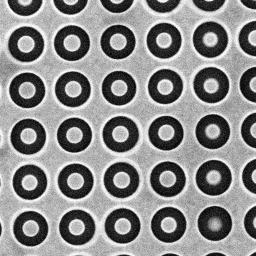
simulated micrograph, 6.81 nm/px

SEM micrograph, an array of small figures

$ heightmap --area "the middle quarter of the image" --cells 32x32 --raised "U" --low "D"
UUUUUUUUUUUUUUUUUUUUUUUUUUUUUUUU
UUUUUUUUUUUUUUUUUUUUUUUDDDDDUUUU
DDDDDUUUUUUDDDDDUUUUUUDDDDDDDUUU
DDDDDDUUUUDDDDDDDUUUUDDDDDDDDDUU
DDDDDDUUUUDDUUUDDDUUUDDDUUUDDDUU
DUUUDDDUUDDDUUUUDDUUUDDUUUUDDDUU
DUUUDDDUUDDDUUUUDDUUUDDDUUUDDDUU
DUUUDDDUUDDDDUUDDDUUUDDDDUDDDDUU
DDDDDDUUUUDDDDDDDDUUUUDDDDDDDUUU
DDDDDDUUUUUDDDDDDUUUUUUDDDDDUUUU
DDDDDUUUUUUUUDDUUUUUUUUUUUUUUUUU
UUUUUUUUUUUUUUUUUUUUUUUUUUUUUUUU
UUUUUUUUUUUUUUUUUUUUUUUUUUUUUUUU
UDDDUUUUUUUUDDDDDUUUUUUDDDDDUUUU
DDDDDDUUUUDDDDDDDDUUUUDDDDDDDUUU
DDDDDDDUUUDDDDDDDDDUUDDDDUDDDDUU
DUUUDDDUUDDDUUUUDDDUUDDDUUUDDDUU
DUUUDDDUUDDDUUUUDDDUUDDDUUUDDDUU
DUUUDDDUUDDDUUUUDDDUUDDDUUUDDDUU
DDUUDDDUUUDDDDDDDDDUUDDDDDDDDUUU
DDDDDDUUUUDDDDDDDDUUUUDDDDDDDUUU
DDDDDUUUUUUDDDDDDUUUUUUUDDDUUUUU
UUUUUUUUUUUUUDDUUUUUUUUUUUUUUUUU
UUUUUUUUUUUUUUUUUUUUUUUUUUUUUUUU
UUUUUUUUUUUUDDDDUUUUUUUUDDDUUUUU
DDDDDDUUUUUDDDDDDDUUUUUDDDDDDUUU
DDDDDDDUUUDDDDDDDDDUUUDDDDDDDDUU
DDUUDDDUUUDDDUUUDDDUUDDDUUUDDDUU
DUUUUDDDUUDDDUUUDDDUUDDDUUUUDDDU
DUUUUDDDUUDDDUUUDDDUUDDDUUUUDDDU
DUUUUDDDUUDDDUUUDDDUUUDDDUUDDDDU
DDDDDDDUUUDDDDDDDDDUUUDDDDDDDDUU